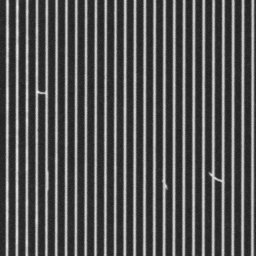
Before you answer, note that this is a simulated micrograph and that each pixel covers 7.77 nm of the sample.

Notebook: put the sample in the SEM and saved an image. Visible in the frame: parallel lines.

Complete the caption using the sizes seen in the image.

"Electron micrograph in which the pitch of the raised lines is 76.3 nanometers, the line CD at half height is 17.5 nanometres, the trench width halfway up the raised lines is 0.0582 micrometres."